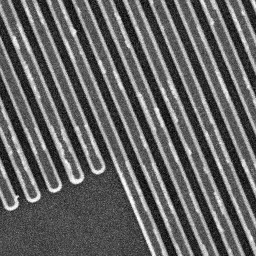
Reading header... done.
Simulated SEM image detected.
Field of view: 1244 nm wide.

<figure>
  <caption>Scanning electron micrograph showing parallel lines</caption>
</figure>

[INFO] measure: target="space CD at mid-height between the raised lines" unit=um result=0.0573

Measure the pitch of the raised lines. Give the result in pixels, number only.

23.6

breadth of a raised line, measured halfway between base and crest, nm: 57.3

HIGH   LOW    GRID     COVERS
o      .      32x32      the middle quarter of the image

...ooo...ooo....ooo...ooo...ooo.
...ooo....ooo...ooo...ooo....ooo
....ooo...ooo...oooo...ooo...ooo
o...ooo...oooo...ooo...ooo....oo
o...oooo...ooo...ooo....ooo...oo
oo...ooo...ooo....ooo...ooo...oo
oo...ooo....ooo...ooo...oooo...o
oo....ooo...ooo...oooo...ooo...o
ooo...ooo...oooo...ooo...ooo....
ooo....ooo...ooo...ooo....ooo...
.ooo...ooo...ooo....ooo...ooo...
.ooo...ooo....ooo...oooo...ooo..
.oooo...ooo...ooo....ooo...ooo..
..ooo...ooo....ooo...ooo...ooo..
..ooo....ooo...ooo...oooo...ooo.
...ooo...ooo...oooo...ooo...ooo.
...ooo...oooo...ooo...ooo....ooo
...oooo...ooo...ooo....ooo...ooo
o...ooo...ooo....ooo...ooo...ooo
o...ooo....ooo...ooo...oooo...oo
o....ooo...ooo...oooo...ooo...oo
oo...ooo....ooo...ooo...ooo....o
oo....ooo...ooo...ooo....ooo...o
ooo...ooo...ooo....ooo...ooo....
ooo...oooo...ooo...ooo....ooo...
oooo...ooo...ooo....ooo...ooo...
.ooo...ooo....ooo...ooo...oooo..
.ooo..........ooo...oooo...ooo..
..oo..........oooo...ooo...ooo..
...............ooo...ooo....ooo.
...............ooo....ooo...ooo.
................ooo...ooo...oooo